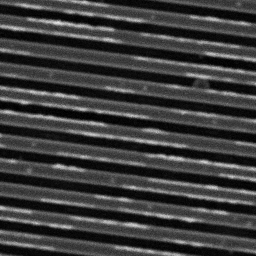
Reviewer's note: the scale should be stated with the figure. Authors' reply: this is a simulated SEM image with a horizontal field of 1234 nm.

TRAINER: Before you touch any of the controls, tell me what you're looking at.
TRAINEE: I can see parallel lines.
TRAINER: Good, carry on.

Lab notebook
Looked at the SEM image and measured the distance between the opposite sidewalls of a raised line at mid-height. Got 63.3 nanometres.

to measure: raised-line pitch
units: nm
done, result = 115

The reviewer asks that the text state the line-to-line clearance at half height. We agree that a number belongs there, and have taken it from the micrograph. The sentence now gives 50.2 nm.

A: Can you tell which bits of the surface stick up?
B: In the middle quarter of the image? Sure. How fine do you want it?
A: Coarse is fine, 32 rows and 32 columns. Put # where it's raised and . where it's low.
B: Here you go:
...........#####################
...................#############
#####.....................######
#############...................
####################............
....#########################...
............####################
...................#############
######.....................#####
#############...................
#####################...........
...#########################....
............####################
....................############
########...................#####
##############..................
########################........
....#########################...
...........#####################
..................##############
######.....................#####
##############..................
######################..........
....##########################..
.............###################
#...................############
#######...................######
##############..................
######################..........
....##########################..
............####################
...................#############